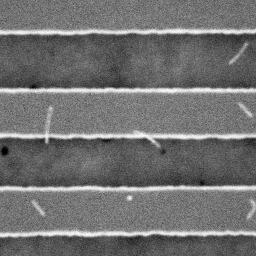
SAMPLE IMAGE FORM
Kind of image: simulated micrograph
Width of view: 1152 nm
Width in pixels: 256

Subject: lines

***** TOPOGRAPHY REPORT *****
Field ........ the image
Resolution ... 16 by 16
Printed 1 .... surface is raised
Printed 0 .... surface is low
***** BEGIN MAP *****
1111111111111111
1111111111111111
0000000000000000
0000000000000000
0000000000000000
0000000000000000
1111111111111111
1111111111111111
1111111111111111
0000000000000000
0000000000000000
0000000000000000
1111111111111111
1111111111111111
1111111111111111
0000000000000000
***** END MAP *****